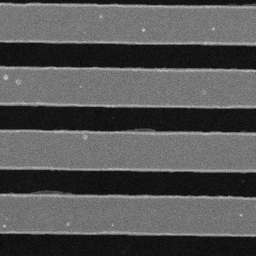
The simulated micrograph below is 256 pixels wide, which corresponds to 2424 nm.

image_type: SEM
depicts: lines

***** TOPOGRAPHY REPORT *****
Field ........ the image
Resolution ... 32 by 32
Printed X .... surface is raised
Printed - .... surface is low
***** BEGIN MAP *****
XXXXXXXXXXX---------------------
XXXXXXXXXXXXXXXXXXXXXXXXXXXXXXXX
XXXXXXXXXXXXXXXXXXXXXXXXXXXXXXXX
XXXXXXXXXXXXXXXXXXXXXXXXXXXXXXXX
XXXXXXXXXXXXXXXXXXXXXXXXXXXXXXXX
---------------XXXXXXXXXXXXXXXXX
--------------------------------
--------------------------------
XXXXXXXXXXXXXXX--X--------------
XXXXXXXXXXXXXXXXXXXXXXXXXXXXXXXX
XXXXXXXXXXXXXXXXXXXXXXXXXXXXXXXX
XXXXXXXXXXXXXXXXXXXXXXXXXXXXXXXX
XXXXXXXXXXXXXXXXXXXXXXXXXXXXXXXX
-------------------------XXXXXXX
--------------------------------
--------------------------------
XXXXXXXXXXXXXXXXXXXXXXXXX--X----
XXXXXXXXXXXXXXXXXXXXXXXXXXXXXXXX
XXXXXXXXXXXXXXXXXXXXXXXXXXXXXXXX
XXXXXXXXXXXXXXXXXXXXXXXXXXXXXXXX
XXXXXXXXXXXXXXXXXXXXXXXXXXXXXXXX
------------------------XXXXXXXX
--------------------------------
--------------------------------
XXXXXXXXXXXXXXXXXXXXXXXX-X------
XXXXXXXXXXXXXXXXXXXXXXXXXXXXXXXX
XXXXXXXXXXXXXXXXXXXXXXXXXXXXXXXX
XXXXXXXXXXXXXXXXXXXXXXXXXXXXXXXX
XXXXXXXXXXXXXXXXXXXXXXXXXXXXXXXX
------------------------XXXXXXXX
--------------------------------
--------------------------------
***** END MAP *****